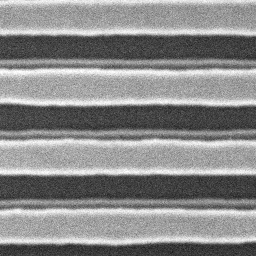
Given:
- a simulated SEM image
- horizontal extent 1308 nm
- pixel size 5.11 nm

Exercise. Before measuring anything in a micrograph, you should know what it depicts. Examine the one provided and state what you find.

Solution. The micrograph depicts lines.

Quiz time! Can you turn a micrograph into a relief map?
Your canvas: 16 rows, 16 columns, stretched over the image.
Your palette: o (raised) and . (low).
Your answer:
oooooooooooooooo
oooooooooooooooo
................
................
oooooooooooooooo
oooooooooooooooo
..oooooo....oooo
................
................
oooooooooooooooo
oooooooooooooooo
................
................
oooooooooooooooo
oooooooooooooooo
................